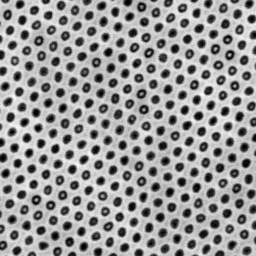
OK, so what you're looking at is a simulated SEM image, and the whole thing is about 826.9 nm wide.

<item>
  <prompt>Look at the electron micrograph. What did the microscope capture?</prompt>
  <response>a regular array of holes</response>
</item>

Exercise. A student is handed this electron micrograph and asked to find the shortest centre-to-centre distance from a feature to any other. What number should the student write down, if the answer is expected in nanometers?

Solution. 48.6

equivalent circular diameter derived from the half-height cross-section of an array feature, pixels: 9.57